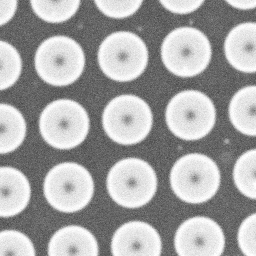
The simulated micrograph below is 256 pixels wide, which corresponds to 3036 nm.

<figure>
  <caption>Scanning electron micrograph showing an array of small figures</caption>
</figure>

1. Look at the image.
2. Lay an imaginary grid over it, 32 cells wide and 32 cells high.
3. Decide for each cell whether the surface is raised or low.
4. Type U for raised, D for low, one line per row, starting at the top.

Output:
UUDDUUUUUUDDUUUUUDDDUUUUUDDDDUUU
UUDDUUUUUDDDDUUUUDDDDDUUDDDDDDDD
UDDDDDUUDDDDDDDDDDDDDDDDDDDDDDDD
DDDDDDDDDDDDDDDDDDDDDDDDDDDDDUUU
DDDDDDDDDDDDDDUUUDDDDUUUUDDDDUUU
UDDDDUUUUUDDDUUUUUDDUUUUUUDDUUUU
UUDDDUUUUUDDUUUUUUDDUUUUUUDDUUUU
UUDDDUUUUUDDUUUUUUDDUUUUUUDDDUUU
UUUDDUUUUUDDDUUUUUDDDUUUUDDDDDUU
UUDDDUUUUUDDDDUUUDDDDDDDDDDDDDDD
UDDDDDDUDDDDDDDDDDDDDDDDDDDDDDDD
DDDDDDDDDDDDDDDDDDDDDDDUUDDDDDUU
DDDDDDDDDDDDDDUUUUDDDUUUUUDDDUUU
UUDDDDUUUUDDDUUUUUUDDUUUUUUDDUUU
UUUDDUUUUUUDDUUUUUUDDUUUUUUDDUUU
UUUDDUUUUUUDDUUUUUUDDUUUUUUDDUUU
UUUDDUUUUUUDDUUUUUUDDDUUUUDDDDUU
UUUDDDUUUUDDDDUUUDDDDDDDDDDDDDDD
UUDDDDDUDDDDDDDDDDDDDDDDDDDDDDDD
DDDDDDDDDDDDDDDDDDDDDDDUUDDDDDUU
DDDDDDDDUDDDDDDUUUDDDDUUUUUDDDUU
UUDDDDUUUUUDDDUUUUUDDDUUUUUDDUUU
UUUDDDUUUUUDDDUUUUUDDUUUUUUDDUUU
UUUUDDUUUUUUDDUUUUUDDDUUUUUDDDUU
UUUUDDUUUUUDDDUUUUUDDDUUUUDDDDDU
UUUDDDUUUUUDDDDUUUDDDDDDDDDDDDDD
UUDDDDDDDDDDDDDDDDDDDDDDDDDDDDDD
DDDDDDDDDDDDDDDDDDDDDDDDUUDDDDDU
DDDDDDDDUUDDDDDUUUUDDDDUUUUDDDUU
UUUDDDDUUUUDDDUUUUUUDDUUUUUUDDUU
UUUUDDUUUUUUDDUUUUUUDDUUUUUUDDUU
UUUUDDUUUUUUDDUUUUUUDDUUUUUUDDUU